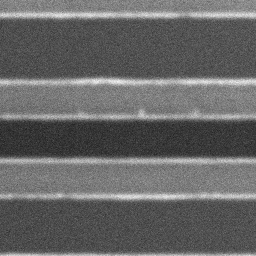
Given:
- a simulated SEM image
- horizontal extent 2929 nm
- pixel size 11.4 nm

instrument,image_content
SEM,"lines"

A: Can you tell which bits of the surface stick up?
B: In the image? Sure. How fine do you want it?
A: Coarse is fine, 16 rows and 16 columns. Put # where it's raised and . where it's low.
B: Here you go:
................
################
################
################
################
................
................
################
################
################
................
................
################
################
################
################